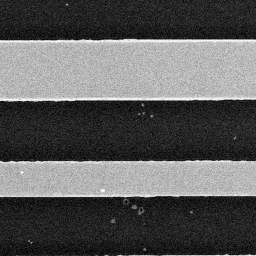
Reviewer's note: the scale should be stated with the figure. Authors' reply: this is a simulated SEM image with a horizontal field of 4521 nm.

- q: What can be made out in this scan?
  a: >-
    lines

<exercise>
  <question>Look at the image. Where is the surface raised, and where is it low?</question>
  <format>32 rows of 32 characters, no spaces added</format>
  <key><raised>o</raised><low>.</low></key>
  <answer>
................................
................................
................................
................................
................................
oooooooooooooooooooooooooooooooo
oooooooooooooooooooooooooooooooo
oooooooooooooooooooooooooooooooo
oooooooooooooooooooooooooooooooo
oooooooooooooooooooooooooooooooo
oooooooooooooooooooooooooooooooo
oooooooooooooooooooooooooooooooo
ooooooooo.......................
................................
................................
................................
................................
................................
................................
................................
oooooooooooooooooooooooooooooooo
oooooooooooooooooooooooooooooooo
oooooooooooooooooooooooooooooooo
oooooooooooooooooooooooooooooooo
oooooooooooooooooooo.o..........
................................
................................
................................
................................
................................
................................
................................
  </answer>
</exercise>